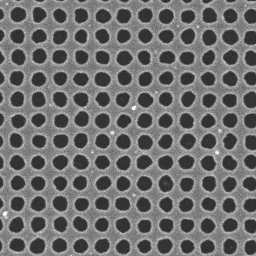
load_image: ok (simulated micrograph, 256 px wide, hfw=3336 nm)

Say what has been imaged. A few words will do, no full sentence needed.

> a regular array of holes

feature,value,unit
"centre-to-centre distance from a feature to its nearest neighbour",265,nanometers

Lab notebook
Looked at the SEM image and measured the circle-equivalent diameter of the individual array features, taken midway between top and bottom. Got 192 nm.